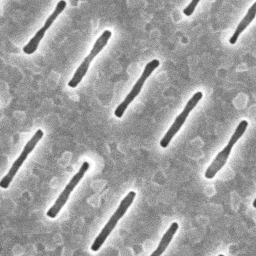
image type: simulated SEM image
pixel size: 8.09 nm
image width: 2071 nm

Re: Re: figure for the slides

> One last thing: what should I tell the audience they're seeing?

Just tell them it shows holes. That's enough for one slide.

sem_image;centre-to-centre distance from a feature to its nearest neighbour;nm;441